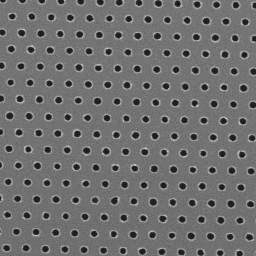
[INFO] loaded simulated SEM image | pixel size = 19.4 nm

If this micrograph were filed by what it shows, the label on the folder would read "a regular array of holes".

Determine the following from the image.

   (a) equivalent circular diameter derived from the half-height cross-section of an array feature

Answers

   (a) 128 nanometres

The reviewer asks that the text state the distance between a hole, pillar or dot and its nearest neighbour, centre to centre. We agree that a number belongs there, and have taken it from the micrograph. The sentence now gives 18.7 px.